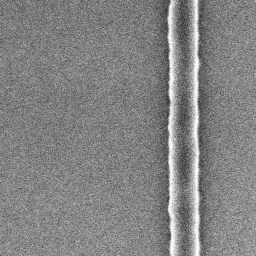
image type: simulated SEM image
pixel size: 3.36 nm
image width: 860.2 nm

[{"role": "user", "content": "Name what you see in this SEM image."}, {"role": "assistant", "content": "one or a few lines or trenches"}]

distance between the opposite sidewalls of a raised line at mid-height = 0.0903 microns